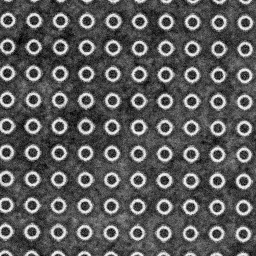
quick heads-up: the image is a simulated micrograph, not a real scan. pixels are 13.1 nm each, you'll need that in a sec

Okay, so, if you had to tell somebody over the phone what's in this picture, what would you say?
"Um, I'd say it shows an array of small figures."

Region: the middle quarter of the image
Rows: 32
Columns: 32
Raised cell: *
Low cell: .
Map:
.....*............*.............
*...****..****...****...***...**
*..*****..****...****..*****..**
*...***...****...****..****...**
.....*.....**.....**....***....*
................................
................................
*...***....***...***....***....*
*..*****..****...****..****...**
*..*****..****...****..****...**
*...***...****...****...***...**
................................
................................
................................
*...***...****...***...****...**
*..*****..****...****..****...**
*..****...****...****..****...**
....***....**....***....***...**
................................
................................
....***....**.....*.....**......
*..****...****...****..****...**
*..****...****..*****..****...**
*...***...****...****..****...**
..................*.....**.....*
................................
................................
....***...****...***....***...**
*..****...****..*****..****...**
*..****...****..*****..****...**
....***...***....***...****...**
................................